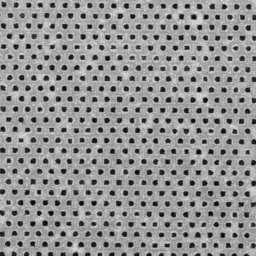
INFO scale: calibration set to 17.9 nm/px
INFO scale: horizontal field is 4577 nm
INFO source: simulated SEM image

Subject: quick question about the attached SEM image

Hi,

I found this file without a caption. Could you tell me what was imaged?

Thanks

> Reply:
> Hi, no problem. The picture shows a regular array of holes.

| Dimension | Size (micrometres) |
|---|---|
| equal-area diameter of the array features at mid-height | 0.114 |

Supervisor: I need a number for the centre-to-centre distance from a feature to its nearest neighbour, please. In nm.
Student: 207